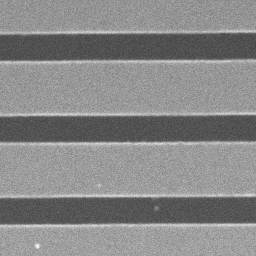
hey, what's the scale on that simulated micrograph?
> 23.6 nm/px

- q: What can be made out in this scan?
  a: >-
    lines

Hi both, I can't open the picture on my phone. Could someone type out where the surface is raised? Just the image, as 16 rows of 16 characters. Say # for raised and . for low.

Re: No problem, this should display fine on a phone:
################
################
................
................
################
################
################
................
................
################
################
################
................
................
################
################